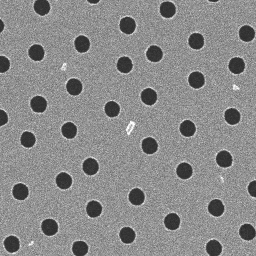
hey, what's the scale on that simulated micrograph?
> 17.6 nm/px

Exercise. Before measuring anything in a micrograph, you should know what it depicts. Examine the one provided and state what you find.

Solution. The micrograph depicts a regular array of holes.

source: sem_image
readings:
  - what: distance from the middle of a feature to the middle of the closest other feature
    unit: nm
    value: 695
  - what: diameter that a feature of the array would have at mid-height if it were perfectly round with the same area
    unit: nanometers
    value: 291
